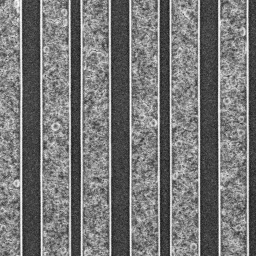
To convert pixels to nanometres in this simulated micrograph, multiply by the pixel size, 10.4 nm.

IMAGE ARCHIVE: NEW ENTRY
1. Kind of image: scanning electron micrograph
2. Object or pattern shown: parallel lines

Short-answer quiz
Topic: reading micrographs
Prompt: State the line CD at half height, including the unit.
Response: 298 nanometres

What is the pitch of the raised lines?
462 nanometers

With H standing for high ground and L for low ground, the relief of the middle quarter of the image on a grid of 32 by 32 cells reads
HLLLHHHHHHHLLLLLLHHHHHHHLLLHHHHH
HLLLHHHHHHHLLLLLLHHHHHHHLLLHHHHH
HLLLHHHHHHHLLLLLLHHHHHHHLLLHHHHH
HLLLHHHHHHHLLLLLLHHHHHHHLLLHHHHH
HLLLHHHHHHHLLLLLLHHHHHHHLLLHHHHH
HLLLHHHHHHHLLLLLLHHHHHHHLLLHHHHH
HLLLHHHHHHHLLLLLLHHHHHHHLLLHHHHH
HLLLHHHHHHHHLLLLLHHHHHHHLLLHHHHH
HLLLHHHHHHHHLLLLLHHHHHHHLLLHHHHH
HLLLHHHHHHHHLLLLLHHHHHHHLLLHHHHH
HLLLHHHHHHHHLLLLLHHHHHHHLLLHHHHH
HLLLHHHHHHHHLLLLLHHHHHHHLLLHHHHH
HLLLHHHHHHHHLLLLLHHHHHHHLLLHHHHH
HLLLHHHHHHHHLLLLLHHHHHHHLLLHHHHH
HLLLHHHHHHHHLLLLLHHHHHHHLLLHHHHH
HLLLHHHHHHHHLLLLLHHHHHHHLLLHHHHH
HLLLHHHHHHHHLLLLLHHHHHHHLLLHHHHH
HLLLHHHHHHHHLLLLLHHHHHHHLLLHHHHH
HLLLHHHHHHHHLLLLLHHHHHHHLLLHHHHH
HLLLHHHHHHHHLLLLLHHHHHHHLLLHHHHH
HLLLHHHHHHHHLLLLLHHHHHHHLLLHHHHH
HLLLHHHHHHHHLLLLLHHHHHHHLLLHHHHH
HLLLHHHHHHHHLLLLLHHHHHHHLLLHHHHH
HLLLHHHHHHHHLLLLLHHHHHHHLLLHHHHH
HLLLHHHHHHHHLLLLLHHHHHHHLLLHHHHH
HLLLLHHHHHHHLLLLLHHHHHHHLLLHHHHH
HLLLHHHHHHHHLLLLLHHHHHHHLLLHHHHH
HLLLHHHHHHHHLLLLLHHHHHHHLLLHHHHH
HLLLHHHHHHHHLLLLLHHHHHHHLLLHHHHH
HLLLHHHHHHHHLLLLLHHHHHHHLLLHHHHH
HLLLHHHHHHHHLLLLLHHHHHHHLLLHHHHH
HLLLHHHHHHHHLLLLLHHHHHHHLLLHHHHH